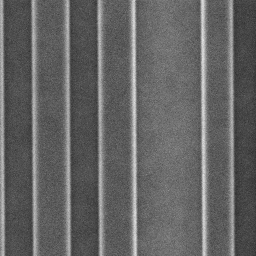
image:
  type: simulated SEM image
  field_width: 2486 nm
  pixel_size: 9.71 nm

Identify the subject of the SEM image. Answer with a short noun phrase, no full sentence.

groups of lines, slits or small figures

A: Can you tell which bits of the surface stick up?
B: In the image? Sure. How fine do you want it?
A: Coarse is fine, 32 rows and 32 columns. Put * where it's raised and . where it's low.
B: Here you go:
....****....*****........****...
....****....*****........****...
....****....*****........****...
....*****...*****........****...
....*****...*****........****...
....*****...*****........****...
....*****...*****........****...
....*****...*****........****...
....*****...*****........****...
....*****...*****........****...
....*****...*****........****...
....*****...*****........****...
....*****...*****........****...
....*****...*****........****...
....*****...*****........****...
....*****...*****........****...
....*****...*****........****...
....*****...*****........****...
....*****...*****........****...
....*****...*****........****...
....*****...*****........****...
....*****...*****........****...
....*****...*****........****...
....*****...*****........****...
....*****....****........****...
....*****....****........****...
....*****....****........****...
....*****....****........****...
....*****....****........****...
....*****....****........****...
....*****....****........****...
....*****....****........****...